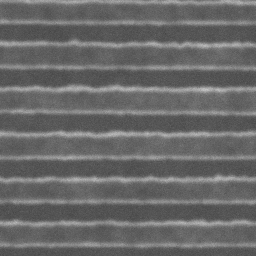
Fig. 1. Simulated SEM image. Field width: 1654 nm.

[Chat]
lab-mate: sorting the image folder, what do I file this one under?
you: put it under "lines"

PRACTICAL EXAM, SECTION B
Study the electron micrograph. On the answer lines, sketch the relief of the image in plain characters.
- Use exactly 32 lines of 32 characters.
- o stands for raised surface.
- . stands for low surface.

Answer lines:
oooooooooooooooooooooooooooooooo
oooooooooooooooooooooooooooooooo
oooooooooooooooooooooooooooooooo
................................
................................
oooooooooooooo.ooooo...o...ooo.o
oooooooooooooooooooooooooooooooo
oooooooooooooooooooooooooooooooo
..oo...oooo.ooo.oooooooooooooooo
................................
................................
oooooooooooooooooooooooooooooooo
oooooooooooooooooooooooooooooooo
oooooooooooooooooooooooooooooooo
................................
................................
................................
oooooooooooooooooooooooooooooooo
oooooooooooooooooooooooooooooooo
oooooooooooooooooooooooooooooooo
................................
................................
oooooooooooooooooooooooooooooooo
oooooooooooooooooooooooooooooooo
oooooooooooooooooooooooooooooooo
................................
................................
................................
oooooooooooooooooooooooooooooooo
oooooooooooooooooooooooooooooooo
oooooooooooooooooooooooooooooooo
................................